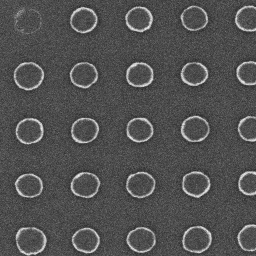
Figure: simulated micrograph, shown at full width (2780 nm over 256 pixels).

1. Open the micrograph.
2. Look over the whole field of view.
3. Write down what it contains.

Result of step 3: a regular array of raised bodies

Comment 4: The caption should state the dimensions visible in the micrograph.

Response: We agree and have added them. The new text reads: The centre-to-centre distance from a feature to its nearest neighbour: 596 nanometres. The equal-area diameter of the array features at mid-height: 277 nm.